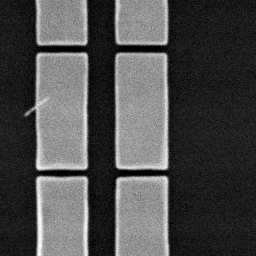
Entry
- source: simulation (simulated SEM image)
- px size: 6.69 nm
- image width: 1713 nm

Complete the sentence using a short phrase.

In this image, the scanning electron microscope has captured wiring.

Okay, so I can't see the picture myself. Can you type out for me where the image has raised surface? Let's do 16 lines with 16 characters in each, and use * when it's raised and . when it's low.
..***..***......
..***..***......
..***..***......
...**..***......
..***..***......
..***..***......
..***..***......
..***..***......
..***..***......
..***..***......
...**...**......
..***..***......
..***..***......
..***..***......
...**..***......
..***..***......